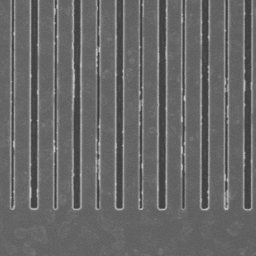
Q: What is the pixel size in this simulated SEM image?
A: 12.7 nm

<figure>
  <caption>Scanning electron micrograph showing parallel lines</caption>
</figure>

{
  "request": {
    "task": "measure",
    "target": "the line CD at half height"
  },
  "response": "213 nanometers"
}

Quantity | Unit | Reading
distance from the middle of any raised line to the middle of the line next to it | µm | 0.272